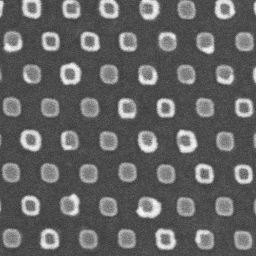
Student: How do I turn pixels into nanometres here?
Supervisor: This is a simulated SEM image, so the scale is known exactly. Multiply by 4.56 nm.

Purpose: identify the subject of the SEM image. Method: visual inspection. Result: a regular array of raised bodies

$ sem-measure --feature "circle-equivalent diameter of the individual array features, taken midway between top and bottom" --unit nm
87.2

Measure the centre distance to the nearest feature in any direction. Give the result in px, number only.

37.5